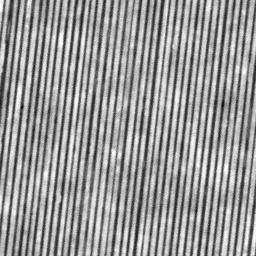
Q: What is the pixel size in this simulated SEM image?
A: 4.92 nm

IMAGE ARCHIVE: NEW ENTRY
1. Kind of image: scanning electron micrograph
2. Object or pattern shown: parallel lines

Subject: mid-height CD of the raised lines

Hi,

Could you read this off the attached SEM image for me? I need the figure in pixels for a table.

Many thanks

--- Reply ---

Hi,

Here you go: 3.11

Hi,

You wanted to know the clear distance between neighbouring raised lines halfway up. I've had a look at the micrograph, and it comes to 0.0189 microns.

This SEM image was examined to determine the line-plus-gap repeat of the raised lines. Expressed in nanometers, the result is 35.1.